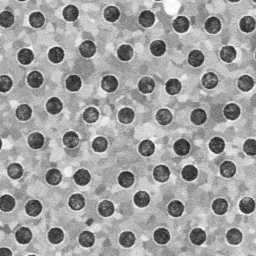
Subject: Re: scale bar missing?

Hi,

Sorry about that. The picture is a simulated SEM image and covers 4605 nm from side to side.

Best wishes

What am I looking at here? a regular array of holes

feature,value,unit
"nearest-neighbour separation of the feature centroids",549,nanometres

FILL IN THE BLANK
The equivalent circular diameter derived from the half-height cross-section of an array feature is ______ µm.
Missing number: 0.319